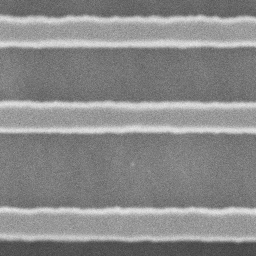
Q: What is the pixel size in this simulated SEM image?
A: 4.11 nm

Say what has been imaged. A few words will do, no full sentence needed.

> lines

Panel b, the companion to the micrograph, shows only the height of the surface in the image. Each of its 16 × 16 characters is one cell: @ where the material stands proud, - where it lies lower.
----------------
@@@@@@@@@@@@@@@@
@@@@@@@@@@@@@@@@
----------------
----------------
----------------
@@@@@@@@@@@@@@@@
@@@@@@@@@@@@@@@@
----------------
----------------
----------------
----------------
----------------
@@@@@@@@@@@@@@@@
@@@@@@@@@@@@@@@@
----------------